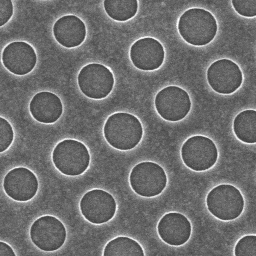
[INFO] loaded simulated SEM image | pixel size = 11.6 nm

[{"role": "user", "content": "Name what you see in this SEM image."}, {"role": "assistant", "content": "a regular array of holes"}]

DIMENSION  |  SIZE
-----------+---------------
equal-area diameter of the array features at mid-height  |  412 nm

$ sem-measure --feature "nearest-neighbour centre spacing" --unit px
55.9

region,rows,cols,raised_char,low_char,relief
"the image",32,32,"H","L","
LLHHHHHHHHHHHLLLLHHHHHHHHHHHHLLL
LLHHHHHHHHHHHLLLLHHHHHHLLLHHHHLL
LHHHHHHLLLHHHHHLHHHHHHLLLLLHHHHH
HHHHHHHLLLLHHHHHHHHHHHLLLLLHHHHH
HHHHHHHLLLLHHHHHHHHHHHHLLLLHHHHH
HLLLHHHLLLHHHHHHHLLLHHHHLLHHHHHH
LLLLHHHHHHHHHHHHLLLLLHHHHHHHHHHH
LLLLLHHHHHHHHHHHLLLLHHHHHHHLLHHH
HLLLHHHHHHLLLHHHHLLLHHHHHHLLLLHH
HHHHHHHHHHLLLLHHHHHHHHHHHHLLLLHH
HHHHHHHHHHLLLLHHHHHHHHHHHHLLLLHH
HHHHHLHHHHLLLLHHHHHHLLLHHHHLLHHH
HHHHLLLLHHHHHHHHHHHLLLLLHHHHHHHH
HHHHLLLLHHHHHHHHHHHLLLLLHHHHHHHH
HHHHLLLLHHHHHHLLLHHHLLLHHHHHHHLL
LHHHHHHHHHHHHLLLLLHHHHHHHHHHHLLL
LLHHHHHHHHHHHLLLLLHHHHHHHHHHHLLL
LLHHHHHHLHHHHLLLLLHHHHHLLLHHHHLL
LHHHHHHLLLLHHHLLLHHHHHHLLLLHHHHH
HHHHHHHLLLLHHHHHHHHHHHHLLLLHHHHH
HHHHHHHLLLLHHHHHHLLLHHHLLLLHHHHH
HLLLHHHHLLHHHHHHLLLLLHHHHHHHHHHH
HLLLLHHHHHHHHHHHLLLLLHHHHHHHHHHH
HLLLLHHHHHHHHHHHHLLLLHHHHHHLLHHH
HLLLHHHHHHLLLLHHHHLHHHHHHHLLLLHH
HHHHHHHHHHLLLLHHHHHHHHHHHHLLLLHH
HHHHHHHHHHLLLLHHHHHHHHHHHHLLLLHH
HHHHHLLHHHHLLLHHHHHHLLLHHHHHLHHH
HHHHLLLLHHHHHHHHHHHHLLLLHHHHHHHH
HHHHLLLLHHHHHHHHHHHHLLLLHHHHHHHL
LHHHLLLLHHHHHLLLLHHHHLLHHHHHHHLL
LLHHHHHHHHHHHLLLLLHHHHHHHHHHHLLL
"